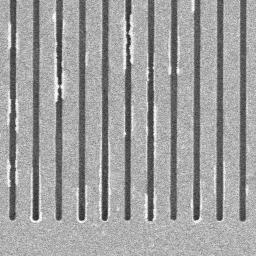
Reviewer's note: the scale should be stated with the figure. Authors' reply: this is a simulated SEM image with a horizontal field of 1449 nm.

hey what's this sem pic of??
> parallel lines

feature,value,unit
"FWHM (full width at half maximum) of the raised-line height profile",94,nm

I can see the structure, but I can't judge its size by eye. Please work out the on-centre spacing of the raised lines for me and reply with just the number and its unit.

130 nanometres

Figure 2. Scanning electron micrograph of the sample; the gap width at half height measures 36.1 nm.